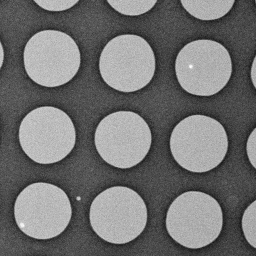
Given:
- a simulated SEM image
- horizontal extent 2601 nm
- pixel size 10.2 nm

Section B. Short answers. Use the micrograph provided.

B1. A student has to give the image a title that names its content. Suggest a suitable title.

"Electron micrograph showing an array of small figures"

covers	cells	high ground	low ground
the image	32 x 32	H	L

LLLLLHHHHLLLLLHHHHHLLLLHHHHHHLLL
LLLLLLLLLLLLLLLHHHLLLLLLHHHHLLLL
LLLLLLLLLLLLLLLLLLLLLLLLLLLLLLLL
LLLLLLLLLLLLLLLLLLLLLLLLLLLLLLLL
LLLLHHHHHLLLLLLHHLLLLLLLLLLLLLLL
LLLHHHHHHLLLLHHHHHLLLLLLHHHLLLLL
LLLHHHHHHHLLLHHHHHHLLLHHHHHHLLLL
LLLHHHHHHHLLHHHHHHHLLLHHHHHHHLLL
LLLHHHHHHHLLHHHHHHHLLLHHHHHHHLLH
LLLLHHHHHLLLLHHHHHHLLLHHHHHHHLLH
LLLLLHHHLLLLLLHHHHLLLLLHHHHHLLLL
LLLLLLLLLLLLLLLLLLLLLLLLHHHLLLLL
LLLLLLLLLLLLLLLLLLLLLLLLLLLLLLLL
LLLLLHHLLLLLLLLLLLLLLLLLLLLLLLLL
LLLHHHHHLLLLLHHHHLLLLLLLHLLLLLLL
LLLHHHHHHLLLHHHHHHLLLLHHHHHLLLLL
LLHHHHHHHLLLHHHHHHHLLLHHHHHHLLLL
LLHHHHHHHLLLHHHHHHHLLHHHHHHHLLLH
LLLHHHHHHLLLHHHHHHHLLHHHHHHHLLLH
LLLLHHHHLLLLLHHHHHLLLLHHHHHHLLLH
LLLLLLLLLLLLLLHHHLLLLLHHHHHLLLLH
LLLLLLLLLLLLLLLLLLLLLLLLLLLLLLLL
LLLLLLLLLLLLLLLLLLLLLLLLLLLLLLLL
LLLHHHHLLLLLLLHHLLLLLLLLLLLLLLLL
LLHHHHHHLLLLHHHHHLLLLLHHHHLLLLLL
LLHHHHHHHLLLHHHHHHLLLLHHHHHLLLLH
LLHHHHHHHLLHHHHHHHLLLHHHHHHHLLLH
LLHHHHHHHLLHHHHHHHLLLHHHHHHHLLHH
LLLHHHHHLLLLHHHHHHLLLHHHHHHHLLHH
LLLLHHHLLLLLHHHHHLLLLHHHHHHLLLLH
LLLLLLLLLLLLLLLLLLLLLLLHHHLLLLLH
LLLLLLLLLLLLLLLLLLLLLLLLLLLLLLLL